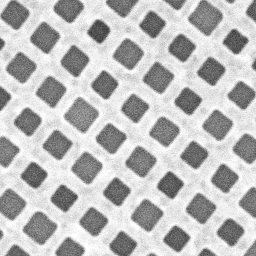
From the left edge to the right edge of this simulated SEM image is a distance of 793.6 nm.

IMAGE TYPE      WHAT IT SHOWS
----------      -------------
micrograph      a regular array of holes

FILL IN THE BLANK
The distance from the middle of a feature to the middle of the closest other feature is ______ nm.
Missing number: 117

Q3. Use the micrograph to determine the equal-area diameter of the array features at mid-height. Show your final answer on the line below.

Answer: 85.9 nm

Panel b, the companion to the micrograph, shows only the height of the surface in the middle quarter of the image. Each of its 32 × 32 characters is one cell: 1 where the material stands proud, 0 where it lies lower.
00000011111111000011110001111111
00000111111111110111100000111111
10001111100011111111000000001111
11111111000001111110000000001111
11111110000000111111000000011111
11111110000000111111100000111111
01111110000001111111110000111000
11111111000011111011111001111000
11100111100111110001111111110000
11000011111111100000011111100000
10000000111111000000001111110000
10000000011111000000011111111000
00000000011111100000111111111100
00000000011111110000111000111111
10000000111111111001111000011111
11000001110001111111110000000111
11100011100000111111100000000111
11110111000000001111100000000111
01111111000000001111110000001111
00111111000000011111111000011110
00111111100000111100111100011110
01111111110000111000011111111100
01110001111001110000001111111000
11100000111111110000000111111000
11000000001111100000000111111100
11000000001111100000000111111110
10000000001111110000001111111111
11000000011111111100011110001111
11100000111100111110111100000111
11110001111000011111111100000011
01111111111000001111111000000011
00111111110000000111111100000111